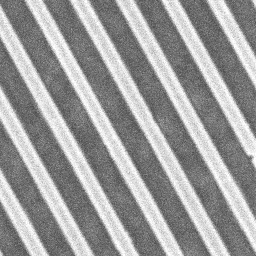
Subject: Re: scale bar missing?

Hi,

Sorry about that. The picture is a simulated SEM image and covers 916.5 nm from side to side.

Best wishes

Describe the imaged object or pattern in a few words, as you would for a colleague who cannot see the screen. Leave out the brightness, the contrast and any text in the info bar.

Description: parallel lines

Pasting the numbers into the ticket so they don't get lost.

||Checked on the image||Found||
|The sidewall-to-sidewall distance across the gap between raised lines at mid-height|94.7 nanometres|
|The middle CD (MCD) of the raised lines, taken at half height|45.8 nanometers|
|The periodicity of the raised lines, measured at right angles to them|142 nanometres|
